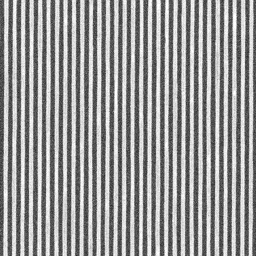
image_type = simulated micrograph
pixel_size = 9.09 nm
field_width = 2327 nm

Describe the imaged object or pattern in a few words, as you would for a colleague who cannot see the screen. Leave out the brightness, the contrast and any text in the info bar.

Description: parallel lines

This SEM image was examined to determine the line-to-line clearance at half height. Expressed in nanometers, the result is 50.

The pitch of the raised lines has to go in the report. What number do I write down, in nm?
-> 76.8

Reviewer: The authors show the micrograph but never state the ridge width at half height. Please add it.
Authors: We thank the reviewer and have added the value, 3.12 px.